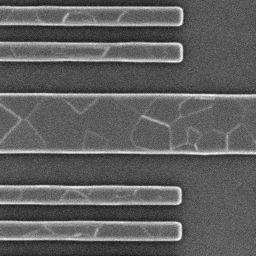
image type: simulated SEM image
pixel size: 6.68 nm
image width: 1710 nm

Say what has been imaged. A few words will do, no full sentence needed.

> wiring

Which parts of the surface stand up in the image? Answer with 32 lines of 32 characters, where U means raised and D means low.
DDDDDDDDDDDDDDDDDDDDDDDDDDDDDDDD
UUUUUUUUUUUUUUUUUUUUUUUDDDDDDDDD
UUUUUUUUUUUUUUUUUUUUUUUDDDDDDDDD
DDDDDDDDDDDDDDDDDDDDDDDDDDDDDDDD
DDDDDDDDDDDDDDDDDDDDDDDDDDDDDDDD
UUUUUUUUUUUUUUUUUUUUUUDDDDDDDDDD
UUUUUUUUUUUUUUUUUUUUUUUDDDDDDDDD
UUUUUUUUUUUUUUUUUUUUUUUDDDDDDDDD
DDDDDDDDDDDDDDDDDDDDDDDDDDDDDDDD
DDDDDDDDDDDDDDDDDDDDDDDDDDDDDDDD
DDDDDDDDDDDDDDDDDDDDDDDDDDDDDDDD
DDDDDDDDDDDDDDDDDDDDDDDDDDDDDDDD
UUUUUUUUUUUUUUUUUUUUUUUUUUUUUUUU
UUUUUUUUUUUUUUUUUUUUUUUUUUUUUUUU
UUUUUUUUUUUUUUUUUUUUUUUUUUUUUUUU
UUUUUUUUUUUUUUUUUUUUUUUUUUUUUUUU
UUUUUUUUUUUUUUUUUUUUUUUUUUUUUUUU
UUUUUUUUUUUUUUUUUUUUUUUUUUUUUUUU
UUUUUUUUUUUUUUUUUUUUUUUUUUUUUUUU
DDDDDDDDDDDDDDDDDDDDDDDDDDDDDDDD
DDDDDDDDDDDDDDDDDDDDDDDDDDDDDDDD
DDDDDDDDDDDDDDDDDDDDDDDDDDDDDDDD
DDDDDDDDDDDDDDDDDDDDDDDDDDDDDDDD
UUUUUUUUUUUUUUUUUUUUUUDDDDDDDDDD
UUUUUUUUUUUUUUUUUUUUUUUDDDDDDDDD
DDDDDUUUUUUUUUUUUUUUUUDDDDDDDDDD
DDDDDDDDDDDDDDDDDDDDDDDDDDDDDDDD
DDDDDDDDDDDDDDDDDDDDDDDDDDDDDDDD
UUUUUUUUUUUUUUUUUUUUUUUDDDDDDDDD
UUUUUUUUUUUUUUUUUUUUUUUDDDDDDDDD
DDDDDDDDDDDDDDDDDDDDDDDDDDDDDDDD
DDDDDDDDDDDDDDDDDDDDDDDDDDDDDDDD